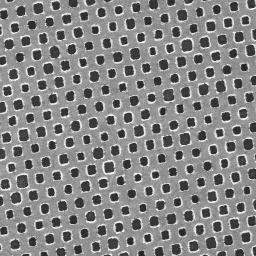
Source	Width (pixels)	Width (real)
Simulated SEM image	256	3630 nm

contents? a regular array of holes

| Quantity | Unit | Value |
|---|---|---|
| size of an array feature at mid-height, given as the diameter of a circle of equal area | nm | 142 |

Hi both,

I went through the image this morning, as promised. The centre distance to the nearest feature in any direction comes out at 245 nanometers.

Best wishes